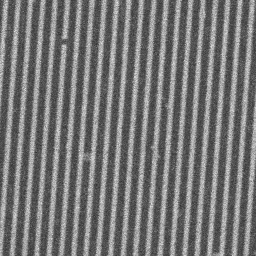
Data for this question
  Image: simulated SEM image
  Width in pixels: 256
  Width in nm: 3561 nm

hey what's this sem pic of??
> parallel lines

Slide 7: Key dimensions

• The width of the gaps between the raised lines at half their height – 118 nm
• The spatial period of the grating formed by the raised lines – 171 nanometres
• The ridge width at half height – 53.7 nanometres